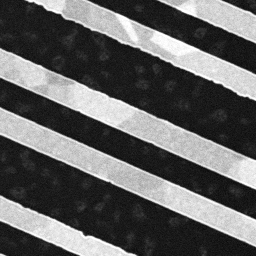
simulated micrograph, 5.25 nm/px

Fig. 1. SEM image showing one or a few lines or trenches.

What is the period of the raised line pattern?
0.346 µm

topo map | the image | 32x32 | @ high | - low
-----@@@@@@@---------@@@@@@@----
-------@@@@@@@---------@@@@@@@@-
---------@@@@@@@----------@@@@@@
-----------@@@@@@@@---------@@@@
--------------@@@@@@@---------@@
----------------@@@@@@@---------
@------------------@@@@@@-------
@@@------------------@@@@@@@----
@@@@@------------------@@@@@@@--
@@@@@@@@-----------------@@@@@@@
--@@@@@@@@------------------@@@@
----@@@@@@@@-----------------@@@
-------@@@@@@@@-----------------
---------@@@@@@@@---------------
@@---------@@@@@@@@-------------
@@@@@--------@@@@@@@@-----------
@@@@@@@---------@@@@@@@@--------
--@@@@@@@---------@@@@@@@@------
----@@@@@@@---------@@@@@@@@----
------@@@@@@@@---------@@@@@@@--
---------@@@@@@@---------@@@@@@@
-----------@@@@@@@---------@@@@@
-------------@@@@@@@---------@@@
----------------@@@@@@@---------
------------------@@@@@@@-------
@@------------------@@@@@@@-----
@@@@------------------@@@@@@@@--
@@@@@@@------------------@@@@@@@
--@@@@@@@------------------@@@@@
-----@@@@@@------------------@@@
-------@@@@@@@-----------------@
---------@@@@@@@----------------